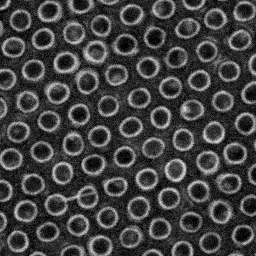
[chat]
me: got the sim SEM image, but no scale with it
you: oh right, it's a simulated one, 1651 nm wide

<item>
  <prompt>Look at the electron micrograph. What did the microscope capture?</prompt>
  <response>a regular array of raised bodies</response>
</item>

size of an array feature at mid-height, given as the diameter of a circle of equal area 20.5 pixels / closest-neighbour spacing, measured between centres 192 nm